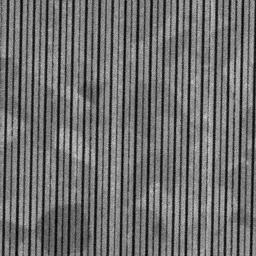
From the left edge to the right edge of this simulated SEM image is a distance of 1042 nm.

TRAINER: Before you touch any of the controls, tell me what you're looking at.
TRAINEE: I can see parallel lines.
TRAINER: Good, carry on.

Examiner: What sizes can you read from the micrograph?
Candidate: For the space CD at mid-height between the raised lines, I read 11.7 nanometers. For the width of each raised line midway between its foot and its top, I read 19.3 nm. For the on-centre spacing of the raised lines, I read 26.4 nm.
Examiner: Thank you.